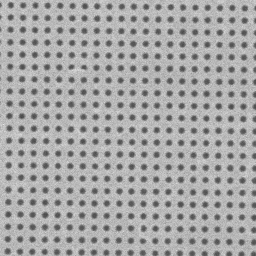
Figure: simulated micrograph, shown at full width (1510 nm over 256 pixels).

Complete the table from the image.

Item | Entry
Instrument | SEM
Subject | a regular array of holes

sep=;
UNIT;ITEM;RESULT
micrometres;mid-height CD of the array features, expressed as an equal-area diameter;0.0371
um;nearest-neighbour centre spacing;0.0713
